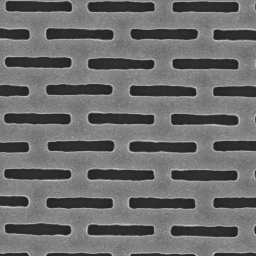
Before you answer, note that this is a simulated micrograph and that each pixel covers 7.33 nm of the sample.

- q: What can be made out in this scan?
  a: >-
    a regular array of holes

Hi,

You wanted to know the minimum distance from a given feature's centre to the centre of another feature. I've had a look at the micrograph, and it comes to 358 nm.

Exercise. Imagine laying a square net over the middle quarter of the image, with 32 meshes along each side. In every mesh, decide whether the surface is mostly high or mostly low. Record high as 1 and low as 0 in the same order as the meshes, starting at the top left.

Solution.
00111100000000000000000111100000
11111111000111111111111111111111
11111111111111111111111111111111
11111111111111111111111111111111
11111111111111111111111111111111
00000000000011111000000000000011
00000000000011110000000000000000
00000000000011111000000000000000
11111111111111111111111111111111
11111111111111111111111111111111
11111111111111111111111111111111
11111111111111111111111111111111
01111100000000000001111111100000
00111100000000000000000111100000
00111100000000000000000111100000
11111111111111111111111111111111
11111111111111111111111111111111
11111111111111111111111111111111
11111111111111111111111111111111
00000000000011111000001100010000
00000000000001110000000000000000
00000000000001110000000000000000
11111111111111111111111111111111
11111111111111111111111111111111
11111111111111111111111111111111
11111111111111111111111111111111
11111100000000000000001111101100
00111100000000000000000111100000
01111100000000000000000111100000
11111111111111111111111111111111
11111111111111111111111111111111
11111111111111111111111111111111